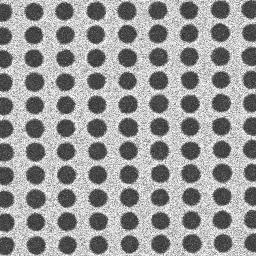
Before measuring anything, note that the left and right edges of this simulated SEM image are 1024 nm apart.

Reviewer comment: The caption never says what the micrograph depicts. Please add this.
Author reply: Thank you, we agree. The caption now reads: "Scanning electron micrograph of a regular array of holes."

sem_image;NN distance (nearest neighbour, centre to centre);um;0.0922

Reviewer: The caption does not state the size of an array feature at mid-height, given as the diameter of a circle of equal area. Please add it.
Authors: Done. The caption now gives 74.3 nanometers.